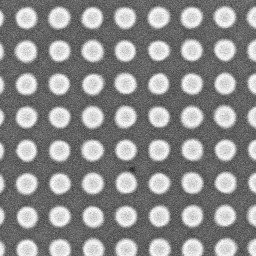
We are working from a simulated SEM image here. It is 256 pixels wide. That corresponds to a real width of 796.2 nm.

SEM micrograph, an array of small figures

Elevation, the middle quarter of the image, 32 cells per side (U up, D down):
DDDDDDDDDDDDDDDDDDDDDDDDDDDDDDDD
DDDDDDDDDDDDDDDDDDDDDDDDDDDDDDDD
DDDDDDDDDDDDDDUUDDDDDDDUUDDDDDDU
UDDDDUUUUUDDDUUUUDDDDDUUUUDDDDUU
UDDDDUUUUUDDDUUUUUDDDUUUUUDDDUUU
UDDDDUUUUUDDDUUUUUDDDUUUUUDDDUUU
UDDDDUUUUDDDDUUUUUDDDUUUUUDDDDUU
DDDDDDUUDDDDDDDDDDDDDDDUDDDDDDDD
DDDDDDDDDDDDDDDDDDDDDDDDDDDDDDDD
DDDDDDDDDDDDDDDDDDDDDDDDDDDDDDDD
DDDDDDDDDDDDDDDDDDDDDDDDDDDDDDDD
UDDDDUUUUDDDDUUUUUDDDDUUUUDDDDUU
UUDDUUUUUUDDDUUUUUDDDUUUUUDDDUUU
UUDDUUUUUUDDDUUUUUDDDUUUUUDDDUUU
UDDDDUUUUUDDDUUUUUDDDDUUUUDDDUUU
DDDDDUUUUDDDDDUUDDDDDDDUUDDDDDUU
DDDDDDDDDDDDDDDDDDDDDDDDDDDDDDDD
DDDDDDDDDDDDDDDDDDDDDDDDDDDDDDDD
DDDDDDDDDDDDDDDDDDDDDDDDDDDDDDDD
DDDDDUUUUDDDDDUUUDDDDDUUUUDDDDUU
UDDDDUUUUUDDDUUUUUDDDUUUUUDDDDUU
UDDDUUUUUUDDDUUUUUDDDUUUUUDDDUUU
UDDDUUUUUUDDDUUUUUDDDUUUUUDDDDUU
UDDDDUUUUDDDDDUUUDDDDDUUUDDDDDUU
DDDDDDDDDDDDDDDDDDDDDDDDDDDDDDDD
DDDDDDDDDDDDDDDDDDDDDDDDDDDDDDDD
DDDDDDDDDDDDDDDDDDDDDDDDDDDDDDDD
DDDDDDUUDDDDDDUUUDDDDDDUUDDDDDUU
UDDDDUUUUUDDDUUUUUDDDDUUUUDDDDUU
UUDDDUUUUUDDDUUUUUDDDUUUUUUDDUUU
UUDDDUUUUUDDDUUUUUDDDUUUUUDDDDUU
UDDDDUUUUDDDDUUUUUDDDDUUUUDDDDUU